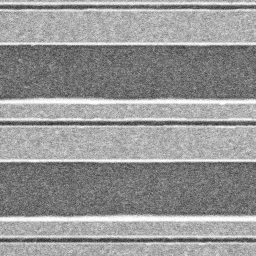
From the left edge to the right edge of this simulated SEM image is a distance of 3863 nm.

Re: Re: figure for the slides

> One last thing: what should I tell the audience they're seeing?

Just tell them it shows lines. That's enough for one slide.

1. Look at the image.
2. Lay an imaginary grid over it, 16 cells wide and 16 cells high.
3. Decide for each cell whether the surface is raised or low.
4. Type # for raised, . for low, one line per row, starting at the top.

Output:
################
################
################
................
................
................
################
################
################
################
................
................
................
................
################
################